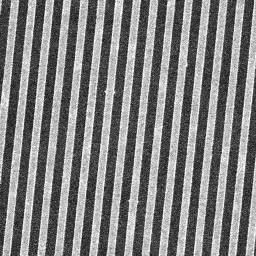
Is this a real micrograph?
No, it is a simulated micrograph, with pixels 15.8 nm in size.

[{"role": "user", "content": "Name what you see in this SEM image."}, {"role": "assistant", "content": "parallel lines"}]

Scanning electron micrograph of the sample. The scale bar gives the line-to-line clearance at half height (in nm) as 159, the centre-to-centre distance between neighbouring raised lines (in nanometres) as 273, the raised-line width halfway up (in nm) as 114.